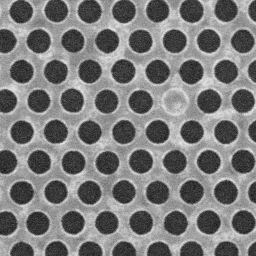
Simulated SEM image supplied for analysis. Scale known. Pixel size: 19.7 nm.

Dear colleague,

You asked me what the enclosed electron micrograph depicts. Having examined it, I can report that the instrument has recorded a regular array of holes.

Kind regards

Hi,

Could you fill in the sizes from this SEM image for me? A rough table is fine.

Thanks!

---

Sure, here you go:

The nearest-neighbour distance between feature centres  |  667 nm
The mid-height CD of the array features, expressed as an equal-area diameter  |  493 nm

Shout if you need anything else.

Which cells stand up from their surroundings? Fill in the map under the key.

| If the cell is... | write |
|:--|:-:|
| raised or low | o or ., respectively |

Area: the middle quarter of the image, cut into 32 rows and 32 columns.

.ooo.....ooo......ooo.....ooo...
.oo.......oo......oo.......oo...
.oo......ooo......oo.......oo...
.ooo.....ooo......ooo.....ooo...
ooooo...ooooo....oooo....ooooo..
oooooooooooooooooooooooooooooooo
....ooooo...oooooo..oooooo...ooo
.....ooo.....oooo.....ooo.....oo
.....ooo......oo......ooo......o
.....oo.......oo......ooo......o
.....ooo......oo......ooo......o
....oooo.....oooo.....ooo.....oo
oooooo.ooo.ooooooo..ooooooo..ooo
oooooooooooooooooooooooooooooooo
oooo....ooooo....oooo....ooooo..
.ooo.....ooo......oo......ooo...
.oo......ooo......oo......ooo...
.oo.......oo......oo.......oo...
.ooo.....ooo......ooo.....ooo...
ooooo...ooooo....oooo....ooooo..
ooooooooo.oooooooooooooooooooooo
oooooooooooooooooo..ooooooo.oooo
.....oooo....oooo.....ooo.....oo
.....ooo......oo......ooo......o
......oo......oo.......oo......o
.....ooo......oo......ooo......o
.....ooo.....oooo.....ooo.....oo
o...ooooo...ooooooo.ooooooo..ooo
oooooooooooooooooooooooooooooooo
ooooo...ooooo....ooooo...ooooo..
.o.o.....ooo......ooo.....ooo...
.oo......ooo......oo.......oo...